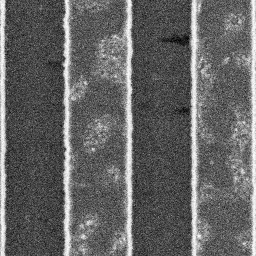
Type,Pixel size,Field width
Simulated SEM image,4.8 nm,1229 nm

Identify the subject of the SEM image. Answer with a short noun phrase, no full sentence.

one or a few lines or trenches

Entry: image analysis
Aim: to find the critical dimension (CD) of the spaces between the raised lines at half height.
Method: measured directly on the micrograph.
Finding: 300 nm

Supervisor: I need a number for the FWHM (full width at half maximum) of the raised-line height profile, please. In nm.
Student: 305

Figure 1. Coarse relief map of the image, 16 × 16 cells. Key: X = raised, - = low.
----XXXX----XXXX
----XXXX----XXXX
----XXXX----XXXX
----XXXX----XXXX
----XXXX----XXXX
----XXXX----XXXX
----XXXX----XXXX
----XXXX----XXXX
----XXXX----XXXX
----XXXX----XXXX
----XXXX----XXXX
----XXXX----XXXX
----XXXX----XXXX
----XXXX----XXXX
----XXXX----XXXX
----XXXX----XXXX